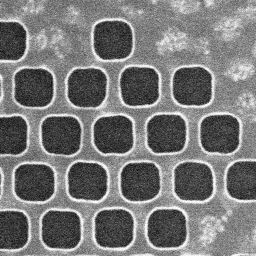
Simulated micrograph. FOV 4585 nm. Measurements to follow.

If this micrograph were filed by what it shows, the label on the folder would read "a regular array of holes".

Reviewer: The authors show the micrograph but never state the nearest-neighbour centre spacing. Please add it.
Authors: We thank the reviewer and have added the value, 942 nm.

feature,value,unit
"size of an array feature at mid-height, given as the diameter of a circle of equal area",42.6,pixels